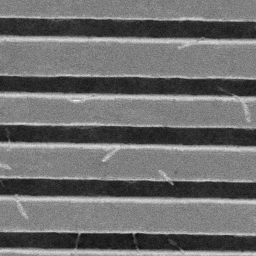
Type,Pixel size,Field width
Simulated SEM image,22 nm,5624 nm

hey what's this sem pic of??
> lines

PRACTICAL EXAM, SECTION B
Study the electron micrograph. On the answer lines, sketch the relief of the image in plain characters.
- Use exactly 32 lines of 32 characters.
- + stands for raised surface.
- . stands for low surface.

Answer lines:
++++++++++++++++++++++++++++++++
++++++++++++++++++++++++++++++++
.........................+++++++
................................
................................
++++++++++++++++++++++++++++++++
++++++++++++++++++++++++++++++++
++++++++++++++++++++++++++++++++
++++++++++++++++++++++++++++++++
..++++++.+++++++++++++++++++++++
................................
................................
++++++++++++++++++++++++++++++++
++++++++++++++++++++++++++++++++
++++++++++++++++++++++++++++++++
++++++++++++++++++++++++++++++++
................................
................................
++++++++++++++++++++++++++++++++
++++++++++++++++++++++++++++++++
++++++++++++++++++++++++++++++++
++++++++++++++++++++++++++++++++
..................++++++++++++++
................................
.++.............................
++++++++++++++++++++++++++++++++
++++++++++++++++++++++++++++++++
++++++++++++++++++++++++++++++++
++++++++++++++++++++++++++++++++
................................
................................
+++++++++++++++++++++++++.......